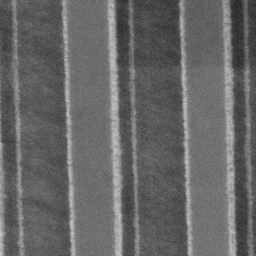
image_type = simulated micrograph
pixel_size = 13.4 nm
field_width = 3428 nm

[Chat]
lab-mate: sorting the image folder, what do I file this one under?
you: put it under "lines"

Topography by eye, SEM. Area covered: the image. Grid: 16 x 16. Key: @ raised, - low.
----@@@----@@@--
----@@@----@@@--
----@@@----@@@--
----@@@----@@@--
----@@@----@@@--
----@@@----@@@--
----@@@----@@@--
----@@@----@@@--
----@@@-----@@--
----@@@-----@@--
----@@@-----@@--
----@@@-----@@--
----@@@-----@@--
----@@@-----@@--
----@@@-----@@@-
----@@@-----@@@-